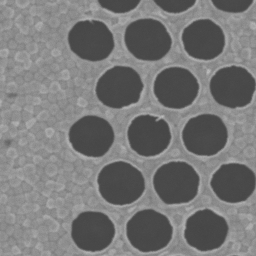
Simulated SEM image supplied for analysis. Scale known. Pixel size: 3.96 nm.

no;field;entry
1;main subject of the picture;a regular array of holes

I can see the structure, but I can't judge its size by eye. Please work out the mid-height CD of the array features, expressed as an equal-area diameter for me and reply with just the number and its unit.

173 nm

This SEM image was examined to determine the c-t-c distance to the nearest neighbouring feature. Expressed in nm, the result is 219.